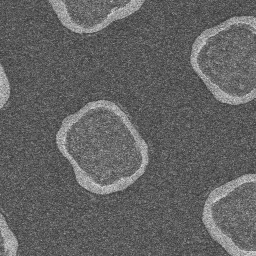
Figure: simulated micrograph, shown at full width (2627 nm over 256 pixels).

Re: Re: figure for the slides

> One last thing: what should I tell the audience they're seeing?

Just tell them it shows raised bodies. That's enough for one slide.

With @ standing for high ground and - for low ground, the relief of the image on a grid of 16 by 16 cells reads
----@@@@--------
----@@@-------@@
-------------@@@
------------@@@@
------------@@@@
-------------@@@
----------------
----@@@@--------
----@@@@@-------
----@@@@@-------
-----@@@@-------
------@@-------@
-------------@@@
-------------@@@
-------------@@@
@-------------@@